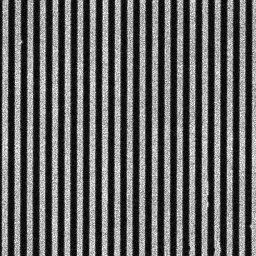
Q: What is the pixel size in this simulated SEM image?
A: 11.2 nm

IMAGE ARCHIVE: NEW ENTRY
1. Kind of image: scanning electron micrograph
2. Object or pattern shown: parallel lines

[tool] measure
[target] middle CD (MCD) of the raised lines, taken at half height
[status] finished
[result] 69.8 nm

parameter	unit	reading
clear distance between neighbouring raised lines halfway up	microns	0.0698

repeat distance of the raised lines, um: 0.14